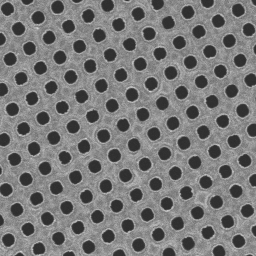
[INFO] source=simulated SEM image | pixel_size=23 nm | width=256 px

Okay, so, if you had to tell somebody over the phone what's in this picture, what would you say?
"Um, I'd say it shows a regular array of holes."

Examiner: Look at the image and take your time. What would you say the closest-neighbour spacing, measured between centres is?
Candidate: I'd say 0.51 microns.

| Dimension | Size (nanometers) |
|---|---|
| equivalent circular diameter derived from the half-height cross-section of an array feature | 287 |